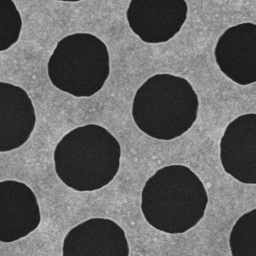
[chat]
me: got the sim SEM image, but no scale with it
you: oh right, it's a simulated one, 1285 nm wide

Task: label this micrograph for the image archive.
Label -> holes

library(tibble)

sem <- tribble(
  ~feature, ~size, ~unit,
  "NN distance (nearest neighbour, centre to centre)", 93.2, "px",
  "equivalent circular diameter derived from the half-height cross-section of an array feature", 330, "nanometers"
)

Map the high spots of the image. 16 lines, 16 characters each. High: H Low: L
LHHHHHHHLLLLHHHH
LHHHHHHHLLLHHHHL
LHHHLLHHHLHHHHLL
HHHLLLLHHHHHHLLL
HHHLLLLHHHHHHHLL
LHHHLLHHHLLLHHHH
LLHHHHHHLLLLHHHH
LLHHHHHHLLLLHHHL
LLHHLLLHHLLHHHLL
HHHLLLLLHHHHHHLL
HHHLLLLHHHLLHHLL
LHHHLLLHHLLLLHHH
LLHHHHHHHLLLLHHH
LLHHHHHHHLLLLHHL
LLHHLLLLHHLHHHLL
HHHHLLLLHHHHHHLL